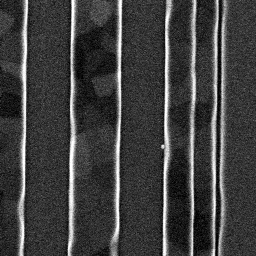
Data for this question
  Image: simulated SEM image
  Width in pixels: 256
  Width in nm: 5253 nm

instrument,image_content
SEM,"wiring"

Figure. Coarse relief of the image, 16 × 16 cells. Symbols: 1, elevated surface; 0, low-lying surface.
1100011100010000
1100011100110000
1100111100110000
1100111000110000
1100111000110000
1100111100110000
1100111100110000
1100111100110000
1100011000110000
1100111000110000
1100111000110000
1100111000110000
1000111000110000
1000111000110000
1000111000110000
1000111000110000